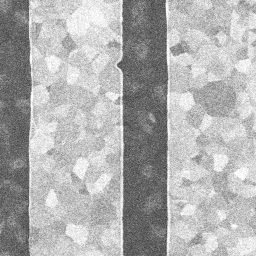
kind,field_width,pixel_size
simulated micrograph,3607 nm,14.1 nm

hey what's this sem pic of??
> one or a few lines or trenches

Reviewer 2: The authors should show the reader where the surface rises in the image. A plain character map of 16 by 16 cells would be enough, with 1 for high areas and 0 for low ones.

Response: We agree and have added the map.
0011111100011111
0011111100011111
0011111100011111
0011111100011111
0011111000011111
0011111100011111
0011111100011111
0011111100011111
0011111100011111
0011111100011111
0011111100011111
0011111100011111
0011111100011111
0011111100011111
0011111100011111
0011111100011111